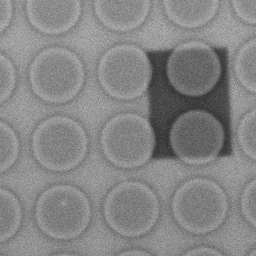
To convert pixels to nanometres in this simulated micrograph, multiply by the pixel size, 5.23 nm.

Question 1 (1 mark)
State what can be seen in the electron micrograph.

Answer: an array of small figures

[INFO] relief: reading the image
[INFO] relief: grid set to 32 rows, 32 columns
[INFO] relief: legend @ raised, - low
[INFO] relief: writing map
@--@@@@@@@--@@@@@@@--@@@@@@--@@@
@--@@@@@@@--@@@@@@---@@@@@@---@@
@---@@@@@@---@@@@@----@@@@-----@
@----@@@@-----@@----------------
--------------------------------
-----------------------@@------@
-----@@@@----@@@@@----@@@@@---@@
@---@@@@@@---@@@@@@--@@@@@@---@@
@@--@@@@@@--@@@@@@@--@@@@@@---@@
@@--@@@@@@--@@@@@@@--@@@@@@---@@
@@--@@@@@@---@@@@@@---@@@@@---@@
@---@@@@@@---@@@@@-----@@@------
------@@------------------------
--------------------------------
---------------@@------@@@@----@
-----@@@@@---@@@@@@---@@@@@---@@
@@--@@@@@@---@@@@@@--@@@@@@@--@@
@@--@@@@@@@--@@@@@@--@@@@@@@--@@
@@--@@@@@@@--@@@@@@---@@@@@@--@@
@@---@@@@@---@@@@@@---@@@@@----@
@----@@@@@----@@@@--------------
--------------------------------
------------------------@-------
-------@@-----@@@@-----@@@@----@
@@---@@@@@----@@@@@---@@@@@@--@@
@@---@@@@@@--@@@@@@@--@@@@@@--@@
@@@--@@@@@@--@@@@@@@--@@@@@@--@@
@@@--@@@@@@--@@@@@@---@@@@@@---@
@@---@@@@@@---@@@@@----@@@@-----
@-----@@@-----------------------
--------------------------------
----------------@@------@@@-----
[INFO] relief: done